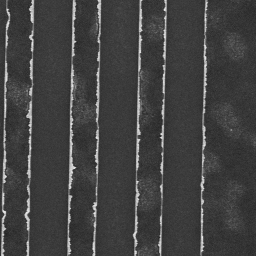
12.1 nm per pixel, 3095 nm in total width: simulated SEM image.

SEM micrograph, one or a few lines or trenches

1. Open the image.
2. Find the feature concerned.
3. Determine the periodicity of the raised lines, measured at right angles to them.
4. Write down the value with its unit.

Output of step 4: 802 nm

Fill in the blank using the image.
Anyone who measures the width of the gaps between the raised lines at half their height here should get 470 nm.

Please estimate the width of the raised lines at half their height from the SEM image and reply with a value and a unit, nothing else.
329 nm